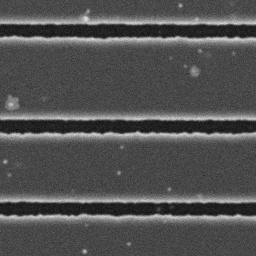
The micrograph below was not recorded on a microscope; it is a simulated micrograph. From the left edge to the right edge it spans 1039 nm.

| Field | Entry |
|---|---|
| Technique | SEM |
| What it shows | lines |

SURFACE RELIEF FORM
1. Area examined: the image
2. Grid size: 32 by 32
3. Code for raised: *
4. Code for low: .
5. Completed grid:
********************************
********************************
********************************
................................
................................
********************************
********************************
********************************
********************************
********************************
********************************
********************************
********************************
********************************
********************************
................................
................................
********************************
********************************
********************************
********************************
********************************
********************************
********************************
********************************
................................
................................
********************************
********************************
********************************
********************************
********************************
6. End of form